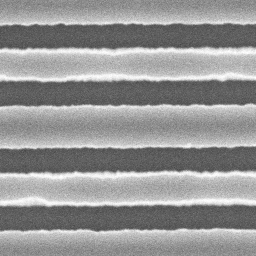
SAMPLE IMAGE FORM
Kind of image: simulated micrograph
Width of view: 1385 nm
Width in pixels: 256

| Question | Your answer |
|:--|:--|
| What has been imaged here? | lines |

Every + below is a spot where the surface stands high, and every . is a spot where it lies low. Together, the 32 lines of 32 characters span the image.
++++++++++++++++++++++++++++++++
++++++++++++++++++++++++++++++++
++++++++++++++++++++++++++++++++
................................
................................
................................
++++++++++++++++++++++++++++++++
++++++++++++++++++++++++++++++++
++++++++++++++++++++++++++++++++
++++++++++++++++++++++++++++++++
................................
................................
................................
++++++++++++++++++++++++++++++++
++++++++++++++++++++++++++++++++
++++++++++++++++++++++++++++++++
++++++++++++++++++++++++++++++++
++++++++++++++++++++++++++++++++
.++.............................
................................
................................
....................++.+.....+..
++++++++++++++++++++++++++++++++
++++++++++++++++++++++++++++++++
++++++++++++++++++++++++++++++++
+.....+++++++++++++++++........+
................................
................................
................................
++++++++++++++++++++++++++++++++
++++++++++++++++++++++++++++++++
++++++++++++++++++++++++++++++++